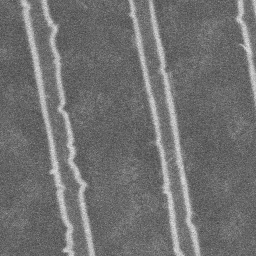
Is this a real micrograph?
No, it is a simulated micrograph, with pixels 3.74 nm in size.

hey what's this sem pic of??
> one or a few lines or trenches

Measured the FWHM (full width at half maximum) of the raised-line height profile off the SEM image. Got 75.4 nm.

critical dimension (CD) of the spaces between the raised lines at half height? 320 nm